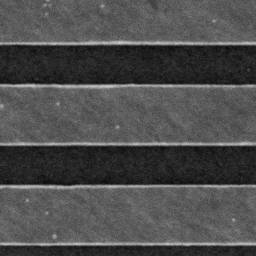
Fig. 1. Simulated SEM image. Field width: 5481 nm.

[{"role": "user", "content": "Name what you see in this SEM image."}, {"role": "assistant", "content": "lines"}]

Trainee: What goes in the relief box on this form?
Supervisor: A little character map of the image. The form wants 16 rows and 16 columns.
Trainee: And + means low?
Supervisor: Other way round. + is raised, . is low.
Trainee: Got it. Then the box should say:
++++++++++++++++
++++++++++++++++
++++++++++++++++
................
................
++++++++++++++++
++++++++++++++++
++++++++++++++++
++++++++++++++++
................
................
................
++++++++++++++++
++++++++++++++++
++++++++++++++++
................